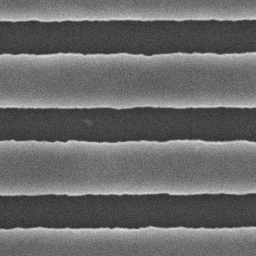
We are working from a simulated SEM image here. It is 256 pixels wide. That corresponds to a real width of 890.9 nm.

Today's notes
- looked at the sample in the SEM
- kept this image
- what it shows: lines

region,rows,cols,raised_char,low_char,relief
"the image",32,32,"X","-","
XXXXXXXXXXXXXXXXXXXXXXXXXXXXXXXX
XXXXXXXXXXXXXXXXXXXXXXXXXXXXXXXX
XXXXXXXX-X-X------X---X---------
--------------------------------
--------------------------------
--------------------------------
--------------------------------
XXXXXXXXXXXXXXXXXXXXXXXXXXXXXXXX
XXXXXXXXXXXXXXXXXXXXXXXXXXXXXXXX
XXXXXXXXXXXXXXXXXXXXXXXXXXXXXXXX
XXXXXXXXXXXXXXXXXXXXXXXXXXXXXXXX
XXXXXXXXXXXXXXXXXXXXXXXXXXXXXXXX
XXXXXXXXXXXXXXXXXXXXXXXXXXXXXXXX
--------------X-----------------
--------------------------------
--------------------------------
--------------------------------
-----------------------X--------
XXXXXXXXXXXXXXXXXXXXXXXXXXXXXXXX
XXXXXXXXXXXXXXXXXXXXXXXXXXXXXXXX
XXXXXXXXXXXXXXXXXXXXXXXXXXXXXXXX
XXXXXXXXXXXXXXXXXXXXXXXXXXXXXXXX
XXXXXXXXXXXXXXXXXXXXXXXXXXXXXXXX
XXXXXXXXXXXXXXXXXXXXXXXXXXXXXXXX
--------------------------------
--------------------------------
--------------------------------
--------------------------------
------------------XX--X--------X
XXXXXXXXXXXXXXXXXXXXXXXXXXXXXXXX
XXXXXXXXXXXXXXXXXXXXXXXXXXXXXXXX
XXXXXXXXXXXXXXXXXXXXXXXXXXXXXXXX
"